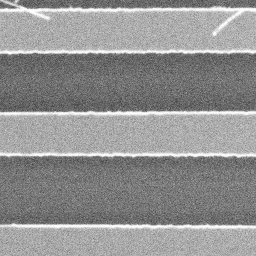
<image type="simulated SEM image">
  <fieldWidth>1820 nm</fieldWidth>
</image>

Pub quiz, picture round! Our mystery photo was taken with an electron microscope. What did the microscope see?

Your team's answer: lines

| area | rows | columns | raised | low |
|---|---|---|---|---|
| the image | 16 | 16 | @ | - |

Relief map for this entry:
----------------
@@@@@@@@@@@@@@@@
@@@@@@@@@@@@@@@@
----------------
----------------
----------------
----------------
@@@@@@@@@@@@@@@@
@@@@@@@@@@@@@@@@
@@@@@@@@@@@@@@@@
----------------
----------------
----------------
----------------
@@@@@@@@@@@@@@@@
@@@@@@@@@@@@@@@@